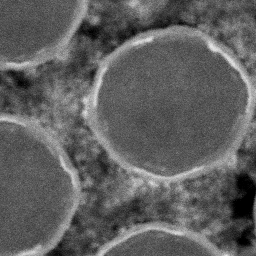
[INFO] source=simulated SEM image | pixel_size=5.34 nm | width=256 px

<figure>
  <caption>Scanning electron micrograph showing raised bodies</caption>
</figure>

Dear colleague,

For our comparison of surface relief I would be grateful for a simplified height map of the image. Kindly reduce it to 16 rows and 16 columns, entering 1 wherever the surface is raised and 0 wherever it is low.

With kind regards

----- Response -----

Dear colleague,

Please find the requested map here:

1111100000000000
1111100000000000
1111000001111000
1110000111111100
0000001111111110
0000001111111111
0000001111111111
1000001111111110
1110001111111110
1111000111111100
1111000011111000
1111100000000000
1111100000000000
1111000000000000
1111000011100000
1110000111111000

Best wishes